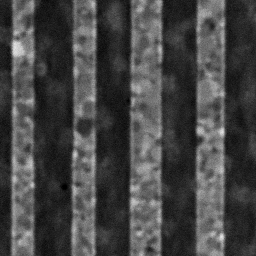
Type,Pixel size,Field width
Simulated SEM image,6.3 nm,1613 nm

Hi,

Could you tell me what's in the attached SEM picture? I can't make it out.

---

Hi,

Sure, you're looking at one or a few lines or trenches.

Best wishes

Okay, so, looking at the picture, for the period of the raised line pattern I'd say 393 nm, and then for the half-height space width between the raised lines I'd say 244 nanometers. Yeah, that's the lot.